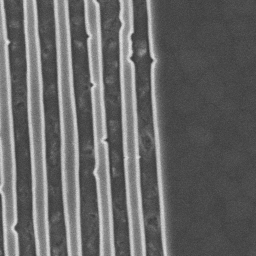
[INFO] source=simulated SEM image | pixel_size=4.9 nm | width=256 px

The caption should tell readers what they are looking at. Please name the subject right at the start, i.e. parallel lines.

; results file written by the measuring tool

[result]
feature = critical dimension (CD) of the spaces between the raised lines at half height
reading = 91.7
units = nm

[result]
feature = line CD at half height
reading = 59.9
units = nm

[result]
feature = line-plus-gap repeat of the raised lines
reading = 153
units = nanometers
